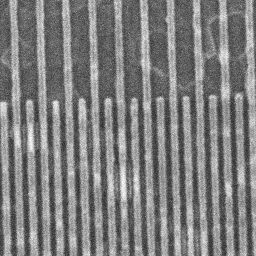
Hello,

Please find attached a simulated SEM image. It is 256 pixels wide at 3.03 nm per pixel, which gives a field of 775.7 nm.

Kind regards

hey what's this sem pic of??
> parallel lines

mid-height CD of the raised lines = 18.2 nm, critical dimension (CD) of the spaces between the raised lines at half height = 21.2 nm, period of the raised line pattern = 0.0397 µm